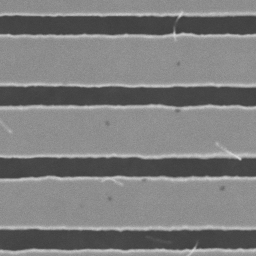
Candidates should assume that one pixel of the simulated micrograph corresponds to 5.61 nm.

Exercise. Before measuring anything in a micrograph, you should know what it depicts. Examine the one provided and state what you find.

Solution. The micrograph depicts lines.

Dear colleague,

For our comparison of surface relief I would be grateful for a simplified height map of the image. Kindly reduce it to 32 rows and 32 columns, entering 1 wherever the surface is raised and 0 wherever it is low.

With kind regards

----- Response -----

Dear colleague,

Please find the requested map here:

11111111111111111111111111111111
11111111111111111111111111111111
00000000000000000000000000000000
00000000000000000000000000000000
11111111111111111111111111111111
11111111111111111111111111111111
11111111111111111111111111111111
11111111111111111111111111111111
11111111111111111111111111111111
11111111111111111111111111111111
11111111111111111111111111111111
00000000000000000000000000000000
00000000000000000000000000000000
11111111111111111111111111111111
11111111111111111111111111111111
11111111111111111111111111111111
11111111111111111111111111111111
11111111111111111111111111111111
11111111111111111111111111111111
11111111111111111111111111111111
00000000000000000000000000000000
00000000000000000000000000000000
11111111111111111111111111111111
11111111111111111111111111111111
11111111111111111111111111111111
11111111111111111111111111111111
11111111111111111111111111111111
11111111111111111111111111111111
11111111111111111111111111111111
00000000000000000000000000000000
00000000000000000000000000000000
11111111111111111111111111111111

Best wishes